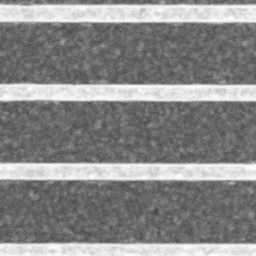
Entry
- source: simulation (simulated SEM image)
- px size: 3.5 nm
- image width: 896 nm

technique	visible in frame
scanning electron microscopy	one or a few lines or trenches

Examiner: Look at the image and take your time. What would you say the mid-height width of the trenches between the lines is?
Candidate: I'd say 230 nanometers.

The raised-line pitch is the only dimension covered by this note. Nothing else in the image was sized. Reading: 277 nm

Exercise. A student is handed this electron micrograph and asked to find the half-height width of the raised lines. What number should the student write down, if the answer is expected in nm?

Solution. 47.6